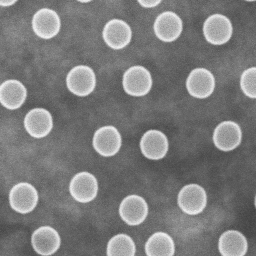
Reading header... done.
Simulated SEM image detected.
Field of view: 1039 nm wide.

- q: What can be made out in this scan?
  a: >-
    a regular array of raised bodies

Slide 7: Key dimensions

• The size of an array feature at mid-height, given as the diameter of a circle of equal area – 116 nanometres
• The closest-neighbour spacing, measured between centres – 221 nm